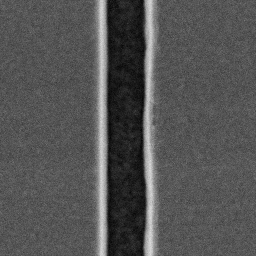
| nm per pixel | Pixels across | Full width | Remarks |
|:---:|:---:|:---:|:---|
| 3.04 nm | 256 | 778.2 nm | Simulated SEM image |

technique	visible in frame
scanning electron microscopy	one or a few lines or trenches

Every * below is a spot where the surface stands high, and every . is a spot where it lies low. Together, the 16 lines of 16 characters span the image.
******...*******
******...*******
******...*******
*******..*******
*******..*******
******...*******
******...*******
******...*******
******...*******
******...*******
******...*******
******...*******
******...*******
*******..*******
******...*******
******...*******